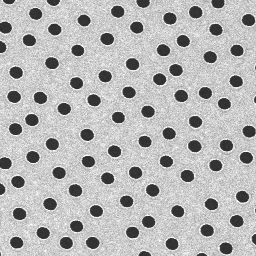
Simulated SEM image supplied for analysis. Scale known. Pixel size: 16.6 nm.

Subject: a regular array of holes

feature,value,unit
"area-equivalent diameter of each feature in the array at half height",212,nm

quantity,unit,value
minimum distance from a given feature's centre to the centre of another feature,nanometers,414